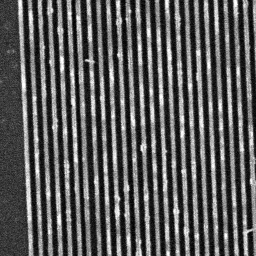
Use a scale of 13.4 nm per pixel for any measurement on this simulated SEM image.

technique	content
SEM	parallel lines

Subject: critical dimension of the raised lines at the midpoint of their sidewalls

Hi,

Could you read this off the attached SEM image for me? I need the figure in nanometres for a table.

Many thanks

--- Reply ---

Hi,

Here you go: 51.7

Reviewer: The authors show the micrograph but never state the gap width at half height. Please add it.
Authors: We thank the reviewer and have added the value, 5.74 px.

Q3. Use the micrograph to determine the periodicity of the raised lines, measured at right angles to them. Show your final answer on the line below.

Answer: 130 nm